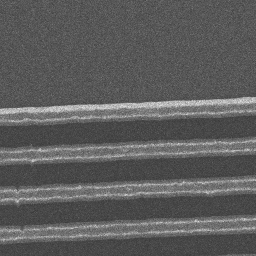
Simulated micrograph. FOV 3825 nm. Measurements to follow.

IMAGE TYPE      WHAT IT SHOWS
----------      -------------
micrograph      parallel lines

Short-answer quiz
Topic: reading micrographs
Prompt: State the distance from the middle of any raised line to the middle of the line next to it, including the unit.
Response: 583 nm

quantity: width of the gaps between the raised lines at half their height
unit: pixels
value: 26.5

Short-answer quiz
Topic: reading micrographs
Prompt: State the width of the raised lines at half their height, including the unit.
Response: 190 nm